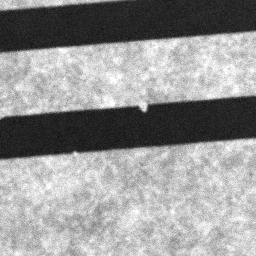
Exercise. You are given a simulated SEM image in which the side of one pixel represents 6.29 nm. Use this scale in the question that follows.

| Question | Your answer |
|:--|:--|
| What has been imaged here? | one or a few lines or trenches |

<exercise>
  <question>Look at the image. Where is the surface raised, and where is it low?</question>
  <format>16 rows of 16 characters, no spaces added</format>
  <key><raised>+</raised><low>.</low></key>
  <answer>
++..............
................
..........++++++
++++++++++++++++
++++++++++++++++
++++++++++++++++
++++++++++......
................
................
......++++++++++
++++++++++++++++
++++++++++++++++
++++++++++++++++
++++++++++++++++
++++++++++++++++
++++++++++++++++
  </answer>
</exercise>